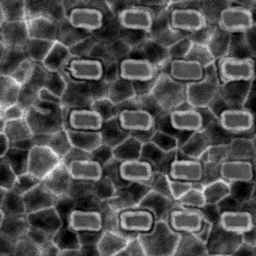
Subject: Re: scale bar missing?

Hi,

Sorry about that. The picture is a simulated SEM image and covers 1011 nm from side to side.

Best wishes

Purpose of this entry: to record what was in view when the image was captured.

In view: a regular array of raised bodies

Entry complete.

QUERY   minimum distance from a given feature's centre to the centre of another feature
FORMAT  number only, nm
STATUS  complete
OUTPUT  195